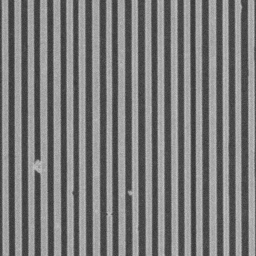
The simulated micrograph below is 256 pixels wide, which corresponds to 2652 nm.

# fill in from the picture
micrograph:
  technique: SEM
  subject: parallel lines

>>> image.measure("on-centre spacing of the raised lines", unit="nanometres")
134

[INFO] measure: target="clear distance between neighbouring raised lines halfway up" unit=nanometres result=77.7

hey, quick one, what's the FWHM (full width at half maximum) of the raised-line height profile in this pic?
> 5.75 pixels